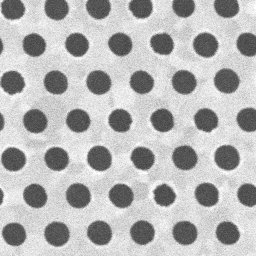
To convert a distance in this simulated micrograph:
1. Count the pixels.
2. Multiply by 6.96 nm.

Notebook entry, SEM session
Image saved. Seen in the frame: a regular array of holes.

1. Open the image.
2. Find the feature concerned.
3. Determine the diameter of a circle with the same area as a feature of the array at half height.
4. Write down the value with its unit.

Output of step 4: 24.9 px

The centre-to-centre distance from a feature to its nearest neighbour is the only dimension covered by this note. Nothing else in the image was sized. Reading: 42.4 px